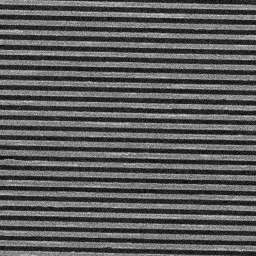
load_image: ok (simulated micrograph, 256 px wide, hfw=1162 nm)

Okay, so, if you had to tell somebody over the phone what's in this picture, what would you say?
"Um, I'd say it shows parallel lines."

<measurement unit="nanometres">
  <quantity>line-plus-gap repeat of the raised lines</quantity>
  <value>45.5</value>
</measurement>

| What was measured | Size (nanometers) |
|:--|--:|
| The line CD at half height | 23.3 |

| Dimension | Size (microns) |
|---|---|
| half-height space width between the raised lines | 0.0233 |